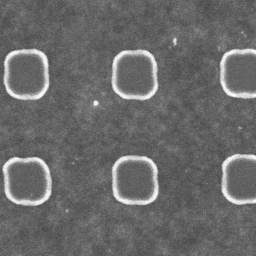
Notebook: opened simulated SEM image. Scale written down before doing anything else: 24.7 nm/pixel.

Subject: raised bodies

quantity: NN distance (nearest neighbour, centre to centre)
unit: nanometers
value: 2620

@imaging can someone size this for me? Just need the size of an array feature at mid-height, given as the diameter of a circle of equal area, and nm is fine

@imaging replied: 1160